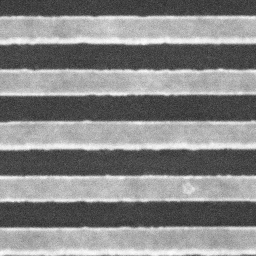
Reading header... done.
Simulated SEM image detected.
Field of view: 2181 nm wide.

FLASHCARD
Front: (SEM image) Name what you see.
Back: lines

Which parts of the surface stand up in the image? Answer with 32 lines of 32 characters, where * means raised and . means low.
................................
................................
********************************
********************************
********************************
................................
................................
................................
................................
********************************
********************************
********************************
................................
................................
................................
********************************
********************************
********************************
****..*...**.*****.*...**.......
................................
................................
................................
********************************
********************************
********************************
................................
................................
................................
..........*....**..*************
********************************
********************************
********************************